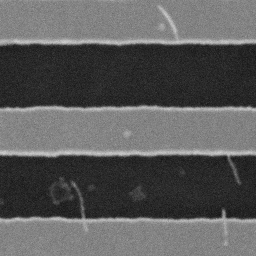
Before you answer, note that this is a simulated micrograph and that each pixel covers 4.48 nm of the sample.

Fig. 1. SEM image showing lines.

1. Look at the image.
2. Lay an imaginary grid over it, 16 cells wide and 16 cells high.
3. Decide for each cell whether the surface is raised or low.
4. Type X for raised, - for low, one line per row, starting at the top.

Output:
XXXXXXXXXXXXXXXX
XXXXXXXXXXXXXXXX
XXXXXXXXXXXXXXXX
----------------
----------------
----------------
----------------
XXXXXXXXXXXXXXXX
XXXXXXXXXXXXXXXX
XXXXXXXXXXXXXXXX
----------------
----------------
----------------
----------------
XXXXXXXXXXXXXXXX
XXXXXXXXXXXXXXXX